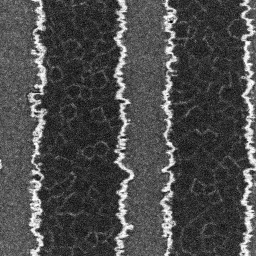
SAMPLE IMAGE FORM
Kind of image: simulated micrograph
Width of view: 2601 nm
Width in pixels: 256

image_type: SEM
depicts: one or a few lines or trenches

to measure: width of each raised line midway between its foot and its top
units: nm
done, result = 835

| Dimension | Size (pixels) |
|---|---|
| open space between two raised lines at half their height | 44.7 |